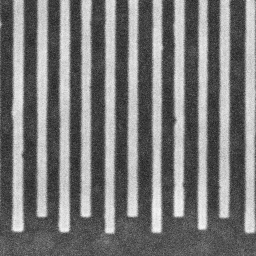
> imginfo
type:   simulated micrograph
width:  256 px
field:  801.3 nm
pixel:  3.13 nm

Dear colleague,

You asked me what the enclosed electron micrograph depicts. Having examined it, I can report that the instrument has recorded parallel lines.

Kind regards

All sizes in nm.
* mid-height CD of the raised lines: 25.5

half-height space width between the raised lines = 48.2 nm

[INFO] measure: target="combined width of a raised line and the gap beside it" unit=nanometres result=72.7